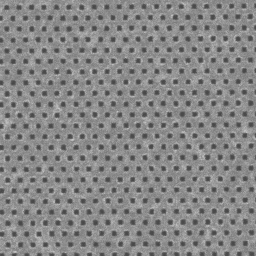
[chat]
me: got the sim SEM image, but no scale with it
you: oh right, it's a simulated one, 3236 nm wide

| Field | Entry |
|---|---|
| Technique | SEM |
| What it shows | a regular array of holes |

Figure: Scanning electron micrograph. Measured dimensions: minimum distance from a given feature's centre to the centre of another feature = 153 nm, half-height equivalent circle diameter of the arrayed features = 75.5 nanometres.